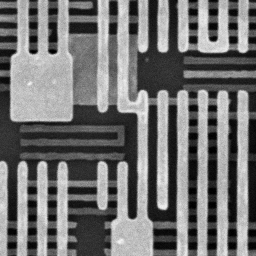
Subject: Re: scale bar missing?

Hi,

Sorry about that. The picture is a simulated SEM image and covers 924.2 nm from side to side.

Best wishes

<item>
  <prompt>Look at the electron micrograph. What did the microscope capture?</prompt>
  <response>wiring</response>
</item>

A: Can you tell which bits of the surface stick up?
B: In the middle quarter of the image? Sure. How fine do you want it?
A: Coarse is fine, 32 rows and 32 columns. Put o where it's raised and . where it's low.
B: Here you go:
oo.......oo...oo................
oo.......oo...oo................
oo......ooo...oo................
oo......ooo...oo................
oo......ooo...oo................
oo......ooo...oo................
oo......ooo...oo................
oo......ooo...oo...oo...oo...oo.
oo.......oo...oo...oo...oo..ooo.
oo.......oo...ooo.ooo...oo..ooo.
oo.......oo...ooooooo...oo...oo.
oo.......oo...ooooooo...oo...oo.
oo................ooo...oo..ooo.
oo.................oo...oo..ooo.
...................oo...oo..ooo.
...................oo...oo..ooo.
...................oo...oo..ooo.
...................oo...oo..ooo.
...................oo...oo...oo.
...................oo...oo...oo.
...................oo...oo...oo.
...................oo...oo...oo.
...................oo...oo...oo.
...................oo..ooo...oo.
...................oo..ooo..ooo.
o........oo...oo...oo..ooo..ooo.
o........oo...oo...oo..ooo..ooo.
o........oo...oo...oo..ooo..ooo.
o........oo...oo...oo..ooo..ooo.
o........oo...oo...oo..ooo..ooo.
o........oo...oo...oo..ooo..ooo.
o.......ooo...oo...oo..ooo..ooo.